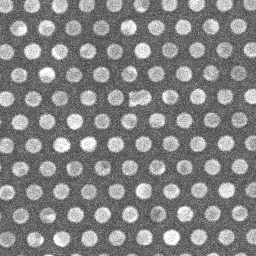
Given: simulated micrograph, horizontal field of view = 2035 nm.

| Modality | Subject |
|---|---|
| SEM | a regular array of raised bodies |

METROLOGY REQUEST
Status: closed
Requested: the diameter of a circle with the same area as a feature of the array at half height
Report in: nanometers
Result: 117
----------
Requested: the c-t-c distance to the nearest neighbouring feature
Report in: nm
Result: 213